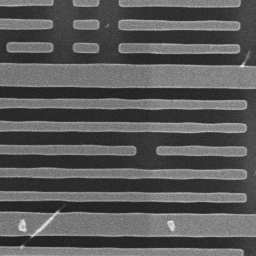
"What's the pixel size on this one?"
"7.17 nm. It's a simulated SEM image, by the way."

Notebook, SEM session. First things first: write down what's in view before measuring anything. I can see groups of lines, slits or small figures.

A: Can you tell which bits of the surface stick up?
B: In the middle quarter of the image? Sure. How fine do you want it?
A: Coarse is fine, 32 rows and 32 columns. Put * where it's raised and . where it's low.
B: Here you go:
********************************
********************************
********************************
********************************
********************************
********************************
................................
................................
................................
********************************
********************************
................................
................................
................................
................................
********************************
********************************
................................
................................
................................
**********......................
******************.....*********
...***************......********
................................
................................
................................
*********************..*********
********************************
..........................******
................................
................................
................................